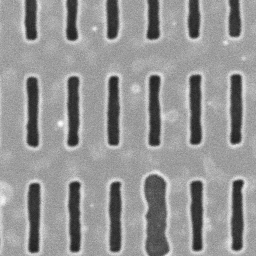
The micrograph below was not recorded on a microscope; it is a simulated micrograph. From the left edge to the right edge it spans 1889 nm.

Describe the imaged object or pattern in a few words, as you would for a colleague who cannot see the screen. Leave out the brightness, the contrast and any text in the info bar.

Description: a regular array of holes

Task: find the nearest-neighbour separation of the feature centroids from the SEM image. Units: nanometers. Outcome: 299